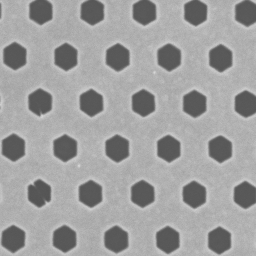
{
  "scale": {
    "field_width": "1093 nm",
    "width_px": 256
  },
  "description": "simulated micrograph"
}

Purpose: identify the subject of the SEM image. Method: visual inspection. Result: a regular array of holes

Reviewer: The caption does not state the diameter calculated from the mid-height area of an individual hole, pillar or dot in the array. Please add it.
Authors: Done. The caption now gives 105 nm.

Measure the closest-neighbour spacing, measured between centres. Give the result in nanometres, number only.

219